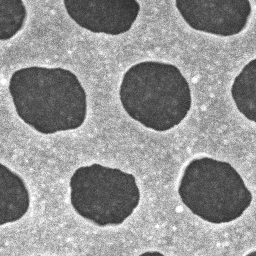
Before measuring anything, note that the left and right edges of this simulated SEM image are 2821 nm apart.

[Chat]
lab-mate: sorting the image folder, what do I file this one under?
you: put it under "holes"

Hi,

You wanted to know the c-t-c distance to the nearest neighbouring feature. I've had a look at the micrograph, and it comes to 1200 nanometres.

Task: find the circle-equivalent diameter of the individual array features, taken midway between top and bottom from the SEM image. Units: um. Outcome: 0.761